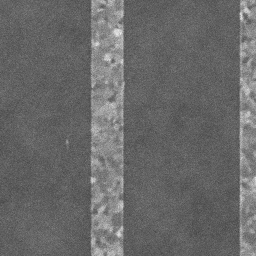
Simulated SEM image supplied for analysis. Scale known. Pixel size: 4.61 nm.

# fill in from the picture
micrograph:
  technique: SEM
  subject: one or a few lines or trenches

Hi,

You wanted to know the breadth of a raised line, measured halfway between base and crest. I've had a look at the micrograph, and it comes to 0.144 microns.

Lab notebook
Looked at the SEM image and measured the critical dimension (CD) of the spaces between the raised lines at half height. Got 118 pixels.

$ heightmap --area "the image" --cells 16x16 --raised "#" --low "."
......##.......#
......##.......#
......##.......#
......##.......#
......##.......#
......##.......#
......##.......#
......##.......#
......##.......#
......##.......#
......##.......#
......##.......#
......##.......#
......##.......#
......##.......#
......##.......#